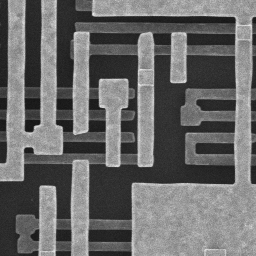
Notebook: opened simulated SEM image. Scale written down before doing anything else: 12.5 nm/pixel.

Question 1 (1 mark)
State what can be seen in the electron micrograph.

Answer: wiring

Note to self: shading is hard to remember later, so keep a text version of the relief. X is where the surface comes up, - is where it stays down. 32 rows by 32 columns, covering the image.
-XX--XX-----XXXXXXXXXXXXXXXXXXXX
-XX--XX-----XXXXXXXXXXXXXXXXXXXX
-XX--XX----------------------XXX
-XX--XX----------------------XXX
-XX--XX--XX-------X--XX------XXX
-XX--XX--XX------XX--XX------XX-
-XX--XX--XX------XX--XX------XXX
-XX--XX--XX------XX--XX------XXX
-XX--XX--XX------XX--XX------XXX
-XX--XX--XX------XX--XX------XXX
-XX--XX--XX-XXXX-XX----------XX-
-XX--XX--XX-XXXX-XX-----------X-
-XX--XX--XX-XXXX-XX-----------X-
-XX--XX--XX--XXX-XX----------XX-
-XX--XX--XX--XX--XX----------XX-
-XX--XX--XX--XX--XX----------XX-
-XXXXXXX-XX--XX--XX----------XX-
-XXXXXXX-----XX--XX----------XX-
-XX-XXXX-----XX--XX----------XX-
-XX----------XX--XX----------XX-
XXX------XX--XX--XX----------XX-
XXX------XX------------------XX-
XXX------XX------------------XX-
-----XX--XX------XXXXXXXXXXXXXXX
-----XX--XX------XXXXXXXXXXXXXXX
-----XX--XX------XXXXXXXXXXXXXXX
-----XX--XX------XXXXXXXXXXXXXXX
-----XX--XX------XXXXXXXXXXXXXXX
-----XX--XX------XXXXXXXXXXXXXXX
-----XX--XX------XXXXXXXXXXXXXXX
-----XX--XX-----XXXXXXXXXXXXXXXX
-----XX--XX-----XXXXXXXXXXXXXXXX